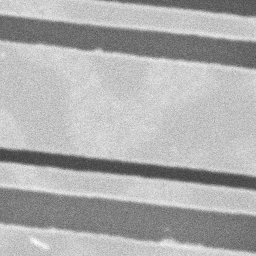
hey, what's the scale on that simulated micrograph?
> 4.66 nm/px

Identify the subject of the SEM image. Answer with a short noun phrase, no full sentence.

lines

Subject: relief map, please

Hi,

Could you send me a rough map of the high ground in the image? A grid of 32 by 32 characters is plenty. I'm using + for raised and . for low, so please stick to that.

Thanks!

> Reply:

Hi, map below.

++++++++++++++++................
++++++++++++++++++++++++++......
.......+++++++++++++++++++++++++
.................+++++++++++++++
..........................++++++
+++.............................
+++++++++++++...................
+++++++++++++++++++++...........
++++++++++++++++++++++++++++++..
++++++++++++++++++++++++++++++++
++++++++++++++++++++++++++++++++
++++++++++++++++++++++++++++++++
++++++++++++++++++++++++++++++++
++++++++++++++++++++++++++++++++
++++++++++++++++++++++++++++++++
++++++++++++++++++++++++++++++++
++++++++++++++++++++++++++++++++
++++++++++++++++++++++++++++++++
.+++++++++++++++++++++++++++++++
..........++++++++++++++++++++++
++.................+++++++++++++
++++++++++..................++++
+++++++++++++++++++++...........
..+++++++++++++++++++++++++++...
............++++++++++++++++++++
....................++++++++++++
.............................+++
................................
++++............................
+++++++++++++...................
+++++++++++++++++++++...........
++++++++++++++++++++++++++++++..